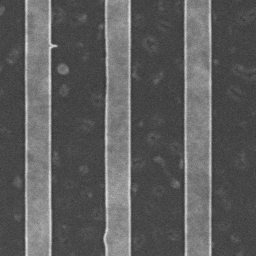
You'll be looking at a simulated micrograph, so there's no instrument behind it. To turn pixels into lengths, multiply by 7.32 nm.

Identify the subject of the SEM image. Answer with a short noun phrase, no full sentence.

one or a few lines or trenches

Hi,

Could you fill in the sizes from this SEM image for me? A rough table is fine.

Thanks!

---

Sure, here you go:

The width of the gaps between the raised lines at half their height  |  0.408 microns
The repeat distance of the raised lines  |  585 nm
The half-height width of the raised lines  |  176 nm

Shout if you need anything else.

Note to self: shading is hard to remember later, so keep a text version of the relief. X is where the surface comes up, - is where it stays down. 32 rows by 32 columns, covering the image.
---XXX-------XXX-------XXX------
---XXX-------XXX-------XXX------
---XXX-------XXX-------XXX------
---XXX-------XXX-------XXX------
---XXX-------XXX-------XXX------
---XXX-------XXX-------XXX------
---XXX-------XXX-------XXX------
---XXX-------XXX-------XXX------
---XXX-X-----XXX-------XXX------
---XXX-------XXX-------XXX------
---XXX-------XXX-------XXX------
---XXX-------XXX-------XXX------
---XXX-------XXX-------XXX------
---XXX-------XXX-------XXX------
---XXX-------XXX-------XXX------
---XXX-------XXX-------XXX------
---XXX-------XXX-------XXX------
---XXX-------XXX-------XXX------
---XXX-------XXX-------XXX------
---XXX-------XXX-------XXX------
---XXX-------XXX-------XXX------
---XXX-------XXX-------XXX------
---XXX-------XXX-------XXX------
---XXX-------XXX-------XXX------
---XXX-------XXX-------XXX------
---XXX-------XXX-------XXX------
---XXX-------XXX-------XXX------
---XXX-------XXX-------XXX------
---XXX-------XXX-------XXX------
---XXX-------XXX-------XXX------
---XXX-------XXX-------XXX------
---XXX-------XXX-------XXX------